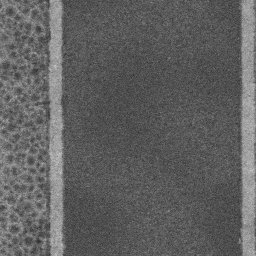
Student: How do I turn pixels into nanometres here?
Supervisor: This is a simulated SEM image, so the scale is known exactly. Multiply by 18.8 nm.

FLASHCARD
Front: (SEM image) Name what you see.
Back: one or a few lines or trenches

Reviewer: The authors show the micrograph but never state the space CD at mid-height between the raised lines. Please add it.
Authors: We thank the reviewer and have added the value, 3650 nm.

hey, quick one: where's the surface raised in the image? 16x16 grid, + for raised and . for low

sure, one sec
+++.............
+++.............
+++.............
+++.............
+++.............
+++.............
+++.............
+++.............
+++.............
+++.............
+++.............
+++.............
+++.............
+++.............
+++.............
+++.............